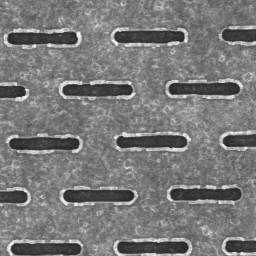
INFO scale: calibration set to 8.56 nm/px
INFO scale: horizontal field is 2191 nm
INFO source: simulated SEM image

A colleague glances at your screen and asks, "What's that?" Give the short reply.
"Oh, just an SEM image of a regular array of holes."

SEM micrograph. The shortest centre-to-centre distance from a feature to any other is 640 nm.